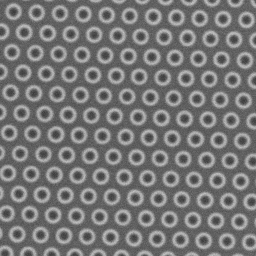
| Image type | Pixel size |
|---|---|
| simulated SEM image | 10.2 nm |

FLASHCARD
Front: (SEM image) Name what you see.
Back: an array of small figures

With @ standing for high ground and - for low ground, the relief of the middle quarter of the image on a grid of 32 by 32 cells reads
--------------------------------
@@@---@@@---@@----@@------------
@@@--@@@@--@@@@--@@@@--@@@---@@@
@@@--@@@@--@@@@--@@@@--@@@@--@@@
------@@----@@---@@@---@@@---@@@
------------------------------@-
---@@@---@@----@@---------------
--@@@@--@@@@--@@@@--@@@---@@@---
--@@@@--@@@@--@@@@--@@@---@@@--@
---@@----@@---@@@---@@@---@@@--@
--------------------------------
@@@--@@@---@@@----@-------------
@@@--@@@@--@@@---@@@---@@@---@@@
@@@--@@@@--@@@@--@@@--@@@@--@@@@
@@----@@---@@@---@@@---@@@--@@@@
-----------------------------@@-
--@@@---@@@----@----------------
--@@@@--@@@---@@@--@@@@--@@@@--@
--@@@---@@@---@@@--@@@@--@@@@--@
---@@---@@@---@@@---@@@--@@@@--@
--------------------------@@----
@@---@@@----@-------------------
@@@--@@@---@@@--@@@@--@@@@--@@@-
@@@--@@@--@@@@--@@@@--@@@@--@@@@
@@---@@@---@@@--@@@@--@@@@--@@@@
-----------------------------@@-
--@@@---@@----@@----------------
--@@@--@@@@--@@@@--@@@---@@@---@
--@@@--@@@@--@@@@--@@@@--@@@@--@
--@@@---@@@---@@@--@@@@--@@@@--@
--------------------------@-----
@@---@@----@@-------------------